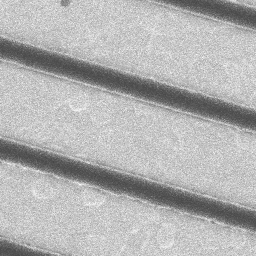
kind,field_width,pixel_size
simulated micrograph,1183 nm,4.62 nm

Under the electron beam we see one or a few lines or trenches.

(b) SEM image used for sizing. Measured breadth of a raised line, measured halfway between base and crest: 112 nm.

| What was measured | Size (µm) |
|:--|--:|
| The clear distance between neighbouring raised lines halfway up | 0.34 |